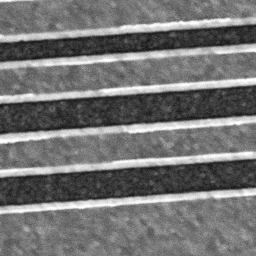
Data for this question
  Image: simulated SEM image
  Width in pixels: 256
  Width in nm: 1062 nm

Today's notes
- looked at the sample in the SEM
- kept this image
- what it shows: one or a few lines or trenches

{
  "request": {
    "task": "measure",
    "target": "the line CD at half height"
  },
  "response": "152 nm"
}